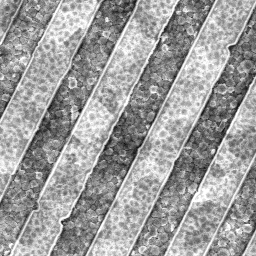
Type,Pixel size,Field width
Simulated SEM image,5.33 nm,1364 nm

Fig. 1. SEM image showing one or a few lines or trenches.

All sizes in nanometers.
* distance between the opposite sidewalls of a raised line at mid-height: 184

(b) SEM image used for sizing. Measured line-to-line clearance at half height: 34.4 px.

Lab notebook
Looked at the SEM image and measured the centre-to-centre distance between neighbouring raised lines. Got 368 nm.